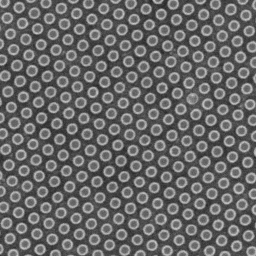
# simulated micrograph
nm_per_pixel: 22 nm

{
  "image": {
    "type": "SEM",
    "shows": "a regular array of raised bodies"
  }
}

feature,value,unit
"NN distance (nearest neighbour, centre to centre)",0.344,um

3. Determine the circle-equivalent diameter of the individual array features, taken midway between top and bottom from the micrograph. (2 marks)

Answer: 0.226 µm